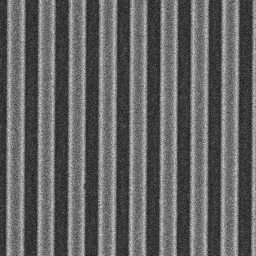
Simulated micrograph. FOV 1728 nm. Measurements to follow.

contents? parallel lines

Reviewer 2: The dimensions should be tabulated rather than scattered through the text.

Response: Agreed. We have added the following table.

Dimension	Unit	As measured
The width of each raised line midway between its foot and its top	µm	0.105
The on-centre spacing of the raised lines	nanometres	207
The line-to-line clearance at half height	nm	98.8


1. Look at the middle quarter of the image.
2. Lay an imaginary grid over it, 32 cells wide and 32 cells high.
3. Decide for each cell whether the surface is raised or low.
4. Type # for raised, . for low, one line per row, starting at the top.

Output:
..###....####....###....####....
..###....####....###....####....
..###....####....###....####....
..###....####....###....####....
..###....####....###....####....
..###....####....###....####....
..###....####....###....####....
..###....####....###....####....
..###....####....###....####....
..###....####....###....####....
..###....####....###....####....
..###....####....###....####....
..###....####....###....####....
.####....####....###....####....
.####....####....###....####....
.####....####....###....####....
.####....####....###....####....
.####....####....###....####....
.####....####....###....####....
.####....####....###....####....
.####....####....###....####....
.####....####....###....####....
.####....####....###....####....
.####....####....###....####....
.####....####....###....####....
.####....####....###....####....
.####....####....###....####....
.####....####....###....####....
.####....####....###....####....
.####....####....###....####....
.####....####....###....####....
.####....####....###....####....